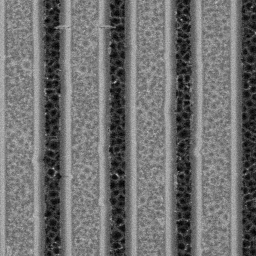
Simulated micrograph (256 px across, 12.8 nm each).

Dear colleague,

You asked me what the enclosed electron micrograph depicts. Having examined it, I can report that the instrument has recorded one or a few lines or trenches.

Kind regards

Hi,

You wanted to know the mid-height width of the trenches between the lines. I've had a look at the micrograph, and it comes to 396 nanometres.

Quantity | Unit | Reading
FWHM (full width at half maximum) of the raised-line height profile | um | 0.439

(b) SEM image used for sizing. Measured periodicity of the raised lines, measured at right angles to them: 840 nanometers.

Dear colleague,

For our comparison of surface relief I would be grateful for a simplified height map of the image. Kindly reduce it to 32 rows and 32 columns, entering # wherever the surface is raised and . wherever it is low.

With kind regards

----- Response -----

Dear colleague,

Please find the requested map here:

####.....####....####....####...
####.....####....####....####...
####.....####....####....####...
####....#####....####....####...
####....#####....####....####...
####....#####....####....####...
####....#####....####....####...
#####...#####....####....####...
#####...#####....####....####...
#####...#####....####....####...
#####....####....####....####...
#####....####....####....####...
#####...#####....####....####...
#####...#####....####....####...
#####...#####....####....####...
#####....####....####....####...
#####....####....####....####...
#####....####....####....####...
#####....####....####....####...
#####....####....####....####...
#####....####....####....####...
#####....####....####....####...
#####....####....####....####...
#####....####....####....####...
#####....####....####....####...
#####....####....####....####...
#####....####....####....####...
#####....####....####....####...
#####....####....####....####...
#####....####....####....####...
#####....####....####....####...
#####....####....####....####...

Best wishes